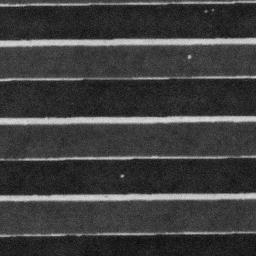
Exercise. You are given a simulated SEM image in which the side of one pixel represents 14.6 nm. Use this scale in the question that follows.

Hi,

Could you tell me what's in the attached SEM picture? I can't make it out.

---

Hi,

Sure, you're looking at lines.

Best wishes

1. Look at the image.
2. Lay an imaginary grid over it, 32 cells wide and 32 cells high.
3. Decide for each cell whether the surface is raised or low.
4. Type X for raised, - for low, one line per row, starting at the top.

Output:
XXXXXXXXXXX---------------------
--------------------------------
--------------------------------
--------------------------------
--------------------------------
XXXXXXXXXXXXXXXXXXXXXXXXXXXXXXXX
XXXXXXXXXXXXXXXXXXXXXXXXXXXXXXXX
XXXXXXXXXXXXXXXXXXXXXXXXXXXXXXXX
XXXXXXXXXXXXXXXXXXXXXXXXXXXXXXXX
XXXXXXXXXXXXXXXXXXXXXXXXXXXXXXXX
--------------------------------
--------------------------------
--------------------------------
--------------------------------
--------------------------------
XXXXXXXXXXXXXXXXXXXXXXXXXXXXXXXX
XXXXXXXXXXXXXXXXXXXXXXXXXXXXXXXX
XXXXXXXXXXXXXXXXXXXXXXXXXXXXXXXX
XXXXXXXXXXXXXXXXXXXXXXXXXXXXXXXX
XXXXXXXXXXXXXXXXXXXXXXXXXXXXXXXX
--------------------------------
--------------------------------
--------------------------------
--------------------------------
--------------------------------
XXXXXXXXXXXXXXXXXXXXXXXXXXXXXXXX
XXXXXXXXXXXXXXXXXXXXXXXXXXXXXXXX
XXXXXXXXXXXXXXXXXXXXXXXXXXXXXXXX
XXXXXXXXXXXXXXXXXXXXXXXXXXXXXXXX
X-------------------------------
--------------------------------
--------------------------------